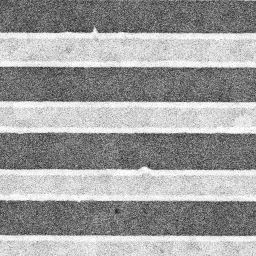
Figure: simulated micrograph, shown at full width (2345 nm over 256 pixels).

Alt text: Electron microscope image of one or a few lines or trenches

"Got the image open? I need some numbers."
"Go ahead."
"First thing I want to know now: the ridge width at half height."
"244 nanometers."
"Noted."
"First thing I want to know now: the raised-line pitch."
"0.619 um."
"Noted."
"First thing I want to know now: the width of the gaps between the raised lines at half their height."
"362 nm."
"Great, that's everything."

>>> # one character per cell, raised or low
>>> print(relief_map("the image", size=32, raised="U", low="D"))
DDDDDDDDDDDDDDDDDDDDDDDDDDDDDDDD
DDDDDDDDDDDDDDDDDDDDDDDDDDDDDDDD
DDDDDDDDDDDDDDDDDDDDDDDDDDDDDDDD
DDDDDDDDDDDDDDDDDDDDDDDDDDDDDDDD
UUUUUUDUUUUUUUUUUUUUUUDUUUUUUDUU
UUUUUUUUUUUUUUUUUUUUUUUUUUUUUUUU
UUUUUUUUUUUUUUUUUUUUUUUUUUUUUUUU
UUUUUUUUUUUUUUUUUUUUUUUUUUUUUUUU
DDDDDDDDDDDDDDDDDDDDDDDDDDDDDDDD
DDDDDDDDDDDDDDDDDDDDDDDDDDDDDDDD
DDDDDDDDDDDDDDDDDDDDDDDDDDDDDDDD
DDDDDDDDDDDDDDDDDDDDDDDDDDDDDDDD
DDDDDDDDDDDDDDDDDDDDDDDDDDDDDDDD
UUUUUUUUUUUUUUUUUUUUUUUUUUUUUUUU
UUUUUUUUUUUUUUUUUUUUUUUUUUUUUUUU
UUUUUUUUUUUUUUUUUUUUUUUUUUUUUUUU
DDDDDDDDDDDDDDDDDDDDDDDDDDDDDDDD
DDDDDDDDDDDDDDDDDDDDDDDDDDDDDDDD
DDDDDDDDDDDDDDDDDDDDDDDDDDDDDDDD
DDDDDDDDDDDDDDDDDDDDDDDDDDDDDDDD
DDDDDDDDDDDDDDDDDDDDDDDDDDDDDDDD
UDDUUUUUUDDDDDDDDUUDDDDDDDDDDDDD
UUUUUUUUUUUUUUUUUUUUUUUUUUUUUUUU
UUUUUUUUUUUUUUUUUUUUUUUUUUUUUUUU
UUUUUUUUUUUUUUUUUUUUUUUUUUUUUUUU
DDDDDDDDDDDDDDDDDDDDDDDDDDDDDDDD
DDDDDDDDDDDDDDDDDDDDDDDDDDDDDDDD
DDDDDDDDDDDDDDDDDDDDDDDDDDDDDDDD
DDDDDDDDDDDDDDDDDDDDDDDDDDDDDDDD
DDDDDDDDDDDDDDDDDDDDDDDDDDDDDDDD
UUUUUUUUUUUUUUUUUUUUUUUUUUUUUUUU
UUUUUUUUUUUUUUUUUUUUUUUUUUUUUUUU